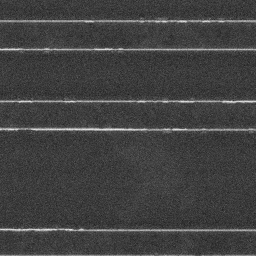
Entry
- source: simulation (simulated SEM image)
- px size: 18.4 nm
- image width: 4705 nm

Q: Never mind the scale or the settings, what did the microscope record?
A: lines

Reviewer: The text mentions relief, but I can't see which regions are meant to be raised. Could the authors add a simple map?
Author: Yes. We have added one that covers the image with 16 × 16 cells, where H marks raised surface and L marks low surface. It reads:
LLLLLLLLLLLLLLLL
HHHHHHHHHHHHHHHH
HHHHHHHHHHHHHHHH
LLLLLLLLLLLLLLLL
LLLLLLLLLLLLLLLL
LLLLLLLLLLLLLLLL
HHHHHHHHHHHHHHHH
HHHHHHHHHHHHHHHH
LLLLLLLLLLLLLLLL
LLLLLLLLLLLLLLLL
LLLLLLLLLLLLLLLL
LLLLLLLLLLLLLLLL
LLLLLLLLLLLLLLLL
LLLLLLLLLLLLLLLL
HHHHHHHHHHHHHHHH
HHHHHHHHHHHHHHHH